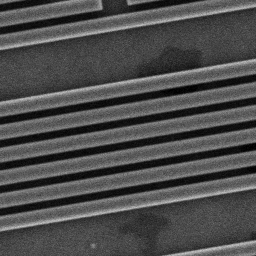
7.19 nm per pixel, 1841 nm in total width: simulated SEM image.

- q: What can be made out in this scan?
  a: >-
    groups of lines, slits or small figures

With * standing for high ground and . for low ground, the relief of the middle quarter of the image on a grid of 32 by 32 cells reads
................................
................................
...........................*****
....................************
...............*****************
.........*********************..
..**********************........
*****************.............**
************.............*******
******.............*************
............********************
.......********************.....
.*********************..........
****************.............***
*********...............********
****.............***************
...........*********************
.....*********************......
*********************...........
**************.............*****
********.............***********
**..............****************
.........**********************.
...*********************........
******************.............*
*************.............******
*******............*************
.............*******************
........********************....
..*********************.........
****************.............***
**********..............********